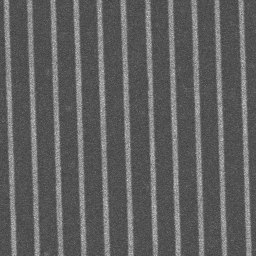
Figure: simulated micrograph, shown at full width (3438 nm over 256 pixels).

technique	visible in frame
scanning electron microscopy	parallel lines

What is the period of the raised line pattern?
0.316 um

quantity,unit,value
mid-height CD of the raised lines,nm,48.7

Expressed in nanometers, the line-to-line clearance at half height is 263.